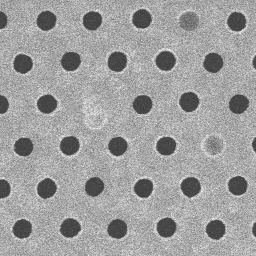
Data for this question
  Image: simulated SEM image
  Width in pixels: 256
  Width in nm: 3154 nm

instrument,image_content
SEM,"a regular array of holes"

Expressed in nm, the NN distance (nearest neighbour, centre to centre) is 577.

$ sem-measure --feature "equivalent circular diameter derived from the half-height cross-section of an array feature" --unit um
0.243